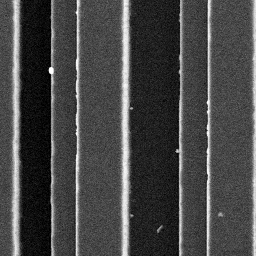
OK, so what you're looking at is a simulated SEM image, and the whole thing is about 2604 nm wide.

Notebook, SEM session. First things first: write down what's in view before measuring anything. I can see lines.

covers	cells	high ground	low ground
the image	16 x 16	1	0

1001111100011111
1001111100011111
1001111100011111
1001111100011111
1001111100011111
1001111100011111
1001111100011111
1001111100011111
1001111100011111
1001111100011111
1001111100011111
1001111100011111
1001111100011111
1001111100011111
1001111100011111
1001111100011111